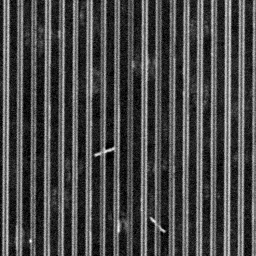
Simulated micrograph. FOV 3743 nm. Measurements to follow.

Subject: parallel lines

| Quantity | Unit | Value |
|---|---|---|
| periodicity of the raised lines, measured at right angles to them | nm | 203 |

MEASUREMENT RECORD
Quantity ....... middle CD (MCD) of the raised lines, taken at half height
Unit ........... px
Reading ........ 4.5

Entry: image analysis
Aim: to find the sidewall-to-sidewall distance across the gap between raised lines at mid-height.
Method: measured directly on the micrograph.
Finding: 144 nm